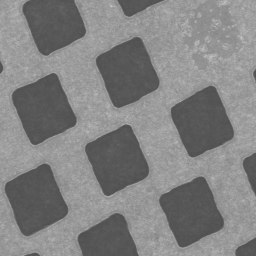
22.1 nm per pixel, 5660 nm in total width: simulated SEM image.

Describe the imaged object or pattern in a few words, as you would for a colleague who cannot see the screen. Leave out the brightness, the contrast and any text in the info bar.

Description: holes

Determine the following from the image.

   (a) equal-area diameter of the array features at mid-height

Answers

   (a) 1350 nm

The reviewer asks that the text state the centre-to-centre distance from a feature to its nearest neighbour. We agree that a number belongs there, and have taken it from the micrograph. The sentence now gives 1980 nm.